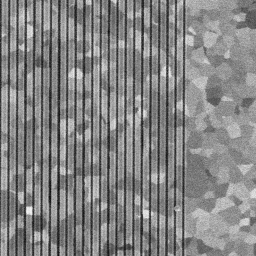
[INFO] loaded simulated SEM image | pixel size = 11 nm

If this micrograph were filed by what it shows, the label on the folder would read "parallel lines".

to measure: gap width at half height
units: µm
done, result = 0.0371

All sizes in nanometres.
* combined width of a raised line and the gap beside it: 91.7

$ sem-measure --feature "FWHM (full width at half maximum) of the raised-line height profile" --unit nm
56.3